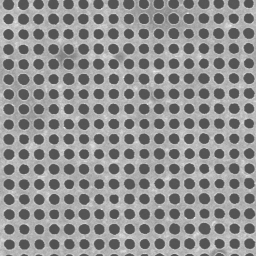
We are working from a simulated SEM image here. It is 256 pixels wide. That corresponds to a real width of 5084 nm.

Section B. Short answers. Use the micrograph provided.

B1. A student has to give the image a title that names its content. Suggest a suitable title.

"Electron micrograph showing a regular array of holes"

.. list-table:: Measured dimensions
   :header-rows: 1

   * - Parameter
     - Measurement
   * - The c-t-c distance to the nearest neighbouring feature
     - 14.8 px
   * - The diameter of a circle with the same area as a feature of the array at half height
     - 0.216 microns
